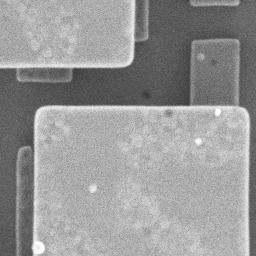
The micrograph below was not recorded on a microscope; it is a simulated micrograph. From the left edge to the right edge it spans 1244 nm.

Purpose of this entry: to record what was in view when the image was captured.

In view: wiring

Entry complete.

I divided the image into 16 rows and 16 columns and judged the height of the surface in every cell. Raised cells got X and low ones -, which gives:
XXXXXXXX--------
XXXXXXXX--------
XXXXXXXX--------
XXXXXXXX--------
----------------
----------------
----------------
--XXXXXXXXXXXXXX
--XXXXXXXXXXXXXX
--XXXXXXXXXXXXXX
--XXXXXXXXXXXXXX
--XXXXXXXXXXXXXX
--XXXXXXXXXXXXX-
--XXXXXXXXXXXXX-
--XXXXXXXXXXXXXX
--XXXXXXXXXXXXXX